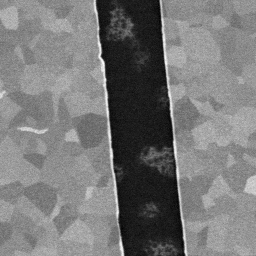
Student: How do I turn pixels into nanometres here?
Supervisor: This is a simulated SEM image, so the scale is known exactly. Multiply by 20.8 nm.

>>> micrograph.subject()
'one or a few lines or trenches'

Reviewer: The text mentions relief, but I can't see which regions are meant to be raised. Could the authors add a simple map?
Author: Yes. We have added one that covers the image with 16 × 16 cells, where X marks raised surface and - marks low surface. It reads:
XXXXXX----XXXXXX
XXXXXX----XXXXXX
XXXXXX----XXXXXX
XXXXXX----XXXXXX
XXXXXXX---XXXXXX
XXXXXXX----XXXXX
XXXXXXX----XXXXX
XXXXXXX----XXXXX
XXXXXXX----XXXXX
XXXXXXX----XXXXX
XXXXXXX----XXXXX
XXXXXXX----XXXXX
XXXXXXX----XXXXX
XXXXXXX----XXXXX
XXXXXXX----XXXXX
XXXXXXXX----XXXX